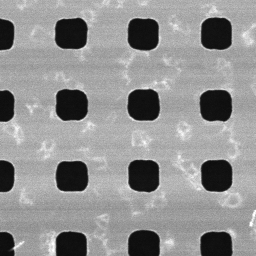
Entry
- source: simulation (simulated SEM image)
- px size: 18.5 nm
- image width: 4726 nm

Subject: a regular array of holes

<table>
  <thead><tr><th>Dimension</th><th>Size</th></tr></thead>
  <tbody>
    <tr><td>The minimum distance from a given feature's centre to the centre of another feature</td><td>1310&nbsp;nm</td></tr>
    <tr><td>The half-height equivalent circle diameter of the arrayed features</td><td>631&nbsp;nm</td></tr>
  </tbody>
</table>